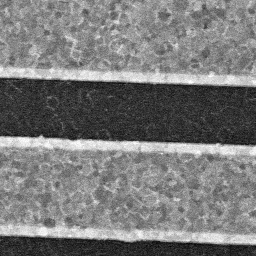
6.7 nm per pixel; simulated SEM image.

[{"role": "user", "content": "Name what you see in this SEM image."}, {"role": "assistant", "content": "one or a few lines or trenches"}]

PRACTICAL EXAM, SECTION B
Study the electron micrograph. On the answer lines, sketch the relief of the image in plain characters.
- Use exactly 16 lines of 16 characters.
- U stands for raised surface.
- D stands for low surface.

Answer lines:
UUUUUUUUUUUUUUUU
UUUUUUUUUUUUUUUU
UUUUUUUUUUUUUUUU
UUUUUUUUUUUUUUUU
UUUUUUUUUUUUUUUU
DDDDDDDDDDDDDDDD
DDDDDDDDDDDDDDDD
DDDDDDDDDDDDDDDD
DDDDDDDDDDDDDDDD
UUUUUUUUUUUUUUUU
UUUUUUUUUUUUUUUU
UUUUUUUUUUUUUUUU
UUUUUUUUUUUUUUUU
UUUUUUUUUUUUUUUU
DDDUUUUUUUUUUUUU
DDDDDDDDDDDDDDDD